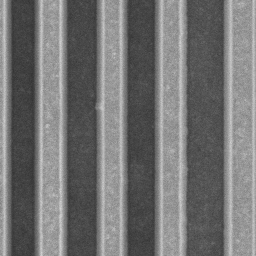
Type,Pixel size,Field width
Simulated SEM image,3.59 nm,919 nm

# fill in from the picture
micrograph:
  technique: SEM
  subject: one or a few lines or trenches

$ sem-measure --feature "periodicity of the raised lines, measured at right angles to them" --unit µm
0.216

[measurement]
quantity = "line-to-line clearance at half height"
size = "34.5 pixels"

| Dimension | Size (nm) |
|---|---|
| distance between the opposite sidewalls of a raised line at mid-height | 91.6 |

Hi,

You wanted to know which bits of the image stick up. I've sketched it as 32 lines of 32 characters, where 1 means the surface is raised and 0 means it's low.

10000111000001100000111000000111
10000111000001100000111000000111
10000111000001100000111000000111
10000111000001100000111000000111
10000111000001100000111000000111
10000111000001110000111000000111
10000111000001100000111000000111
10000111000001110000111000000111
10000111000001100000111000000111
10000111000001100000111000000111
10000111000001100000111000000111
10000111000001100000111000000111
10000111000011100000111000000111
10000111000011110000111000000111
10000111000001100000111000000111
10000111000001100000111000000111
10000111000001100000111000000111
10000111000001100000111000000111
10000111000001100000111000000111
10000111000001110000111000000111
10000111000001110000111000000111
10000111000001110000111000000111
10000111000001110000111000000111
10000111000001100000111000000111
10000111000001100000111000000111
10000111000001100000111000000111
10000111000011110000111000001111
10000111000011110000111000001111
10000111000011110000111000001111
10000111000011110000111000001111
10000111000011110000111000001111
10000111000011100000111000001111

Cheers